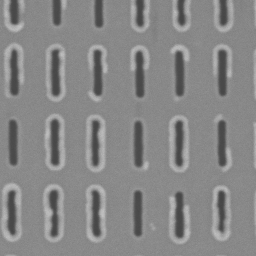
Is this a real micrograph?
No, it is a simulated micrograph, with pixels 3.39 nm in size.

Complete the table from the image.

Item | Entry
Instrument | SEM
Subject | a regular array of holes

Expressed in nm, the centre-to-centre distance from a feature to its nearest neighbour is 141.